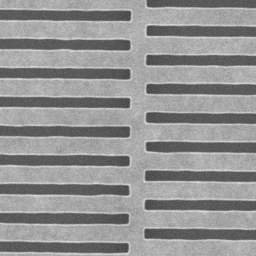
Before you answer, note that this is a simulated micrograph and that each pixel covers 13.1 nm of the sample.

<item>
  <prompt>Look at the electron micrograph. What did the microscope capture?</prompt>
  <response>groups of lines, slits or small figures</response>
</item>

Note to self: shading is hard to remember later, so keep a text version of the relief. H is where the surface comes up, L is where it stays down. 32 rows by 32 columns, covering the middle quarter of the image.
HHHHHHHHHHHHHHHHHHHHHLLLLLLLLLLL
LLLLLLLLLLLLLLLLLHHHHHHHHHHHHHHH
LLLLLLLLLLLLLLLLLHHHHHHHHHHHHHHH
LLLLLLLLLLLLLLLLLHHHHHHHHHHHHHHH
HHHHHHHHHHHHHHHHHHHHHHHHHHHHHHHH
HHHHHHHHHHHHHHHHHHHHLLLLLLLLLLLL
HHHHHHHHHHHHHHHHHHHHLLLLLLLLLLLL
HHHHHHHHHHHHHHHHHHHHHLLLLLLLLLLL
LLLLLLLLLLLLLLLLHHHHHHHHHHHHHHHH
LLLLLLLLLLLLLLLLLHHHHHHHHHHHHHHH
LLLLLLLLLLLLLLLLLHHHHHHHHHHHHHHH
HHHHHHHHHHHHHHHHHHHHHHHHHHHHHHHH
HHHHHHHHHHHHHHHHHHHHLLLLLLLLLLLL
HHHHHHHHHHHHHHHHHHHHLLLLLLLLLLLL
HHHHHHHHHHHHHHHHHHHHHLLLLLLLLLLL
HHHHHHHHHHHHHHHHHHHHHHHHHHHHHHHH
LLLLLLLLLLLLLLLLLHHHHHHHHHHHHHHH
LLLLLLLLLLLLLLLLLHHHHHHHHHHHHHHH
HHHHHHHHHLLLLLLLHHHHHHHHHHHHHHHH
HHHHHHHHHHHHHHHHHHHHHLLLLLLLLLLL
HHHHHHHHHHHHHHHHHHHHLLLLLLLLLLLL
HHHHHHHHHHHHHHHHHHHHHLLLLLLLLLLL
HHHHHHHHHHHHHHHHHHHHHHHHHHHHHHHH
LLLLLLLLLLLLLLLLLHHHHHHHHHHHHHHH
LLLLLLLLLLLLLLLLLHHHHHHHHHHHHHHH
LLLLLLLLLLLLLLLLHHHHHHHHHHHHHHHH
HHHHHHHHHHHHHHHHHHHHHHHHHHHHHHHH
HHHHHHHHHHHHHHHHHHHHLLLLLLLLLLLL
HHHHHHHHHHHHHHHHHHHHLLLLLLLLLLLL
HHHHHHHHHHHHHHHHHHHHHHHHHHHHHHHH
LLLLLLLLLLLLLLLLHHHHHHHHHHHHHHHH
LLLLLLLLLLLLLLLLHHHHHHHHHHHHHHHH